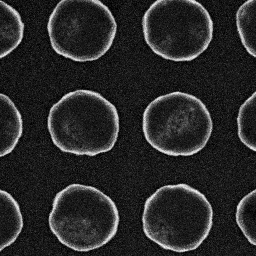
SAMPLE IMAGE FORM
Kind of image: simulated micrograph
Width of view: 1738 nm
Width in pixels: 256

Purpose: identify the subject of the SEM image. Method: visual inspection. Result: raised bodies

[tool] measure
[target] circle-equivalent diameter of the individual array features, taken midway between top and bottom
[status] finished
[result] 66.5 px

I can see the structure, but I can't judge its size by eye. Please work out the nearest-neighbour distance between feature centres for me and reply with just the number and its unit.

637 nm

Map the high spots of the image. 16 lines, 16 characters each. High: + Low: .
+...+++..++++..+
+..++++..++++..+
+..++++..++++..+
....++....++....
................
................
+...+++..++++..+
+..++++..++++..+
+..++++..++++..+
....++....++....
................
................
+...+++..++++..+
+..++++..++++..+
+..++++..++++..+
....++....++....